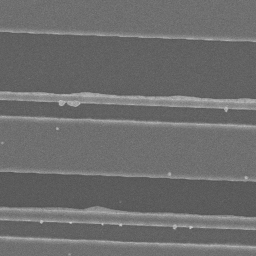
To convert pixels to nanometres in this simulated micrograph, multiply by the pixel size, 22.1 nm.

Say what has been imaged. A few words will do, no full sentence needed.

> lines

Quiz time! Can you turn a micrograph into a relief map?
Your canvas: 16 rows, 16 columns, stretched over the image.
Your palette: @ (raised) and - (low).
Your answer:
@@@@@@@@@@@@@@@@
@@@@@@@@@@@@@@@@
--------------@@
----------------
----------------
----------------
@@@@@@@@@@@@@@@@
@@@@@@@@@@@@@@@@
@@@@@@@@@@@@@@@@
@@@@@@@@@@@@@@@@
@@@@@@@@@@@@@@@@
----------------
----------------
@@@@@@@@@@@@@---
@@@@@@@@@@@@@@@@
@@@@@@@@@@@@@@@@